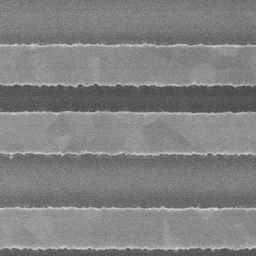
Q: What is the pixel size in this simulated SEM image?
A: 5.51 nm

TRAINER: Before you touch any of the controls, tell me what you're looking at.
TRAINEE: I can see lines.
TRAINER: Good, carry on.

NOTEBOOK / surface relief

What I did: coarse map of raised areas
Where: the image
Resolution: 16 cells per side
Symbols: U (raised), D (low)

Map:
DDDDDDDDDDDDDDDD
DDDDDDDDDDDDDDDD
DDDDDDDDDDDDDDDD
UUUUUUUUUUUUUUUU
UUUUUUUUUUUUUUUU
DDDDDDDDDDDDDDDD
DDDDDDDDDDDDDDDD
UUUUUUUUUUUUUUUU
UUUUUUUUUUUUUUUU
UUUUUUUUUUUUUUUU
DDDDDDDDDDDDDDDD
DDDDDDDDDDDDDDDD
DDDDDDDDDDDDDDDD
UUUUUUUUUUUUUUUU
UUUUUUUUUUUUUUUU
DUUUUUUUUUUUDUUU